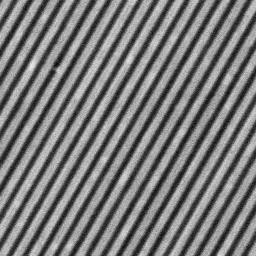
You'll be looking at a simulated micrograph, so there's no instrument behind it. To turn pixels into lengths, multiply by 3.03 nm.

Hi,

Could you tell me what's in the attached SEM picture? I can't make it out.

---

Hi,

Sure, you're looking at parallel lines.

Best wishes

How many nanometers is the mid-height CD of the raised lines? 18.8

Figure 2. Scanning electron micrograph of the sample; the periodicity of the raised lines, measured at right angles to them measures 0.041 microns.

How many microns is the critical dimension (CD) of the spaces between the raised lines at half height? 0.0214